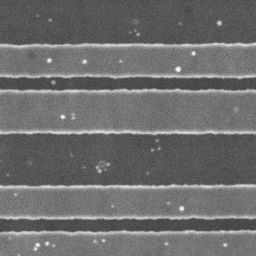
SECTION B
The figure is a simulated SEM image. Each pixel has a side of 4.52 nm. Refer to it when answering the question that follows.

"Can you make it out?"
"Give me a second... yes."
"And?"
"lines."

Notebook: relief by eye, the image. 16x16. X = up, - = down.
----------------
----------------
----------------
XXXXXXXXXXXXXXXX
XXXXXXXXXXXXXXXX
XXXXXXXXXXXXXXXX
XXXXXXXXXXXXXXXX
XXXXXXXXXXXXXXXX
----------------
----------------
----------------
----------------
XXXXXXXXXXXXXXXX
XXXXXXXXXXXXXXXX
XXXXXXXXXXXXXXXX
XXXXXXXXXXXXXXXX